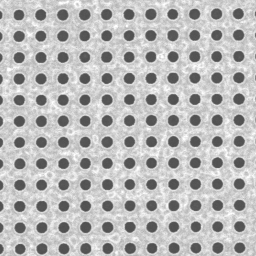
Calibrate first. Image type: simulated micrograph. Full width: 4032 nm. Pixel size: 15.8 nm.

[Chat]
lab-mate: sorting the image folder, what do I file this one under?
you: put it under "a regular array of holes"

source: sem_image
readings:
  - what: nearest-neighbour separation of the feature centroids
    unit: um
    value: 0.332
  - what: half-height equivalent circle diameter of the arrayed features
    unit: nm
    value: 179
